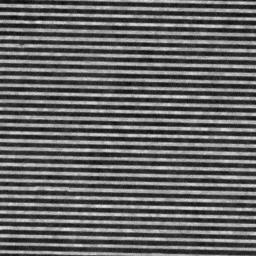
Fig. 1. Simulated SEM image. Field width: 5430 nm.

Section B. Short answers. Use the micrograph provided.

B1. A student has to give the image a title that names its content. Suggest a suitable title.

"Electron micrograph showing parallel lines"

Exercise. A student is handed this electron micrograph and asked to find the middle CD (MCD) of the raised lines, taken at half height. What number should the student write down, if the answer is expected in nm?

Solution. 53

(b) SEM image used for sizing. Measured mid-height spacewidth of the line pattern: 0.117 µm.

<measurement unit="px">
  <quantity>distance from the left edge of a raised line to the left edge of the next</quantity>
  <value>7.93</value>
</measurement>